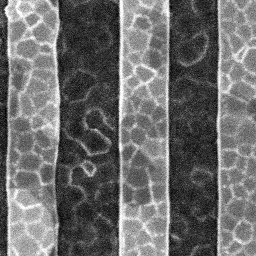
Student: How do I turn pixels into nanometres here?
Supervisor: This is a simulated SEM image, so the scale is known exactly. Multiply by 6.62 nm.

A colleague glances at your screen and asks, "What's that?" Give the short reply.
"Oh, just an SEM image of one or a few lines or trenches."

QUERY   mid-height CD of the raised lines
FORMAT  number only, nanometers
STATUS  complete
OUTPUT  316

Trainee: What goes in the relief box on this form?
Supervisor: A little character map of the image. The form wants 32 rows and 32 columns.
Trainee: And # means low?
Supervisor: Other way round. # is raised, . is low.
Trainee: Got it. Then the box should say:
.######........######......#####
.######........######......#####
.######........######......#####
.######........######......#####
.######........######......#####
.######........######.......####
.######........######.......####
.######........######.......####
.######........######......#####
.######........######......#####
.######........######......#####
.######........######......#####
.######........######......#####
.######........######......#####
.######........######......#####
.######........######......#####
.######........######......#####
.######........######......#####
.######........######......#####
.######........######......#####
.######........######.......####
.######........######......#####
.######........######......#####
.######........######.......####
.######........######.......####
.######........######.......####
.######........######.......####
.######........######......#####
.######........######......#####
.######........######......#####
.######........######......#####
.######........######......#####